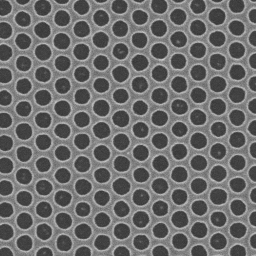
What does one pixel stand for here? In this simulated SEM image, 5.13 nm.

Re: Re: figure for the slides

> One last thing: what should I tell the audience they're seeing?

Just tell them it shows a regular array of holes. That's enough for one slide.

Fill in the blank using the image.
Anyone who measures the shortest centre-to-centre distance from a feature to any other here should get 0.113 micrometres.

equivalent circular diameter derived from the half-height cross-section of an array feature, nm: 84.9